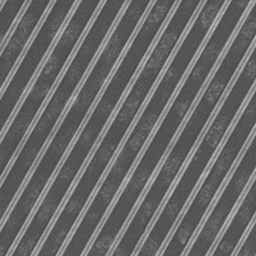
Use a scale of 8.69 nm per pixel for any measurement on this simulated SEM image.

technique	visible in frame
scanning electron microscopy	parallel lines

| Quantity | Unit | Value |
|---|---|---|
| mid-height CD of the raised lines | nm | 38.7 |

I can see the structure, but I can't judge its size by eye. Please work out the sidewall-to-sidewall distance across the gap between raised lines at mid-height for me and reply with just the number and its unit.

147 nanometres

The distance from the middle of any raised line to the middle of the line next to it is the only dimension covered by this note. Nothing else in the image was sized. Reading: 189 nm